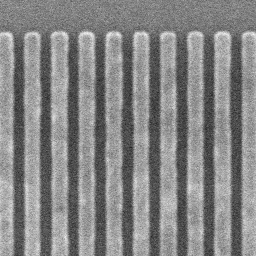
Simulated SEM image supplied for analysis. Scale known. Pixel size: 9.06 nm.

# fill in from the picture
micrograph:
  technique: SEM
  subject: wiring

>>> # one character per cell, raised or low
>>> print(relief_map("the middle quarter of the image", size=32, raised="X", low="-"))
X---XXXX--XXXX----XXX---XXXX---X
X---XXXX--XXXX----XXX---XXXX---X
X---XXXX--XXXX---XXXX---XXXX---X
X---XXXX--XXXX---XXXX---XXXX---X
X---XXXX---XXX---XXXX---XXXX---X
X---XXX----XXX---XXXX---XXXX---X
X---XXX----XXX---XXXX---XXXX---X
X---XXX----XXX---XXXX---XXXX---X
X---XXX----XXX---XXXX---XXXX---X
X---XXXX---XXX---XXXX---XXXX---X
X---XXXX---XXX---XXXX---XXXX---X
X---XXXX---XXX----XXX---XXXX---X
X---XXX----XXX----XXX---XXXX---X
X---XXX----XXX----XXX---XXXX---X
X---XXX----XXX----XXX---XXXX---X
X---XXX----XXX----XXX---XXXX---X
X---XXX----XXX----XXX---XXXX---X
X---XXX----XXX----XXX---XXXX---X
X---XXX----XXX----XXX---XXXX---X
X---XXX----XXX----XXX---XXXX---X
X---XXX----XXX----XXX---XXXX---X
X---XXX----XXX----XXX---XXXX---X
X---XXX----XXX----XXX----XXX---X
X---XXX----XXX----XXX----XXX---X
X---XXX----XXX----XXX----XXX---X
X---XXX----XXX----XXX----XXX---X
X---XXX----XXX----XXX---XXXX---X
X---XXX----XXX----XXX---XXXX---X
X---XXX----XXX----XXX---XXXX---X
X---XXX----XXX----XXX---XXXX---X
X---XXX----XXX----XXX---XXXX---X
X---XXX----XXX----XXX---XXXX---X